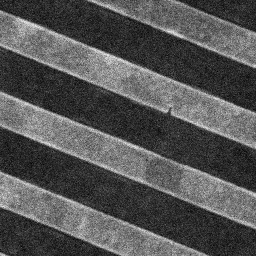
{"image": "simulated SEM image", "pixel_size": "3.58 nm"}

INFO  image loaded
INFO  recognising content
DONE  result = one or a few lines or trenches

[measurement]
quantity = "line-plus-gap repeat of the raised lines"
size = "267 nm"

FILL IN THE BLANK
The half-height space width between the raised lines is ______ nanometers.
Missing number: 151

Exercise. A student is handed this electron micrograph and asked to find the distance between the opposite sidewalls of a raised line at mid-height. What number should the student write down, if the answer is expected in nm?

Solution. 114